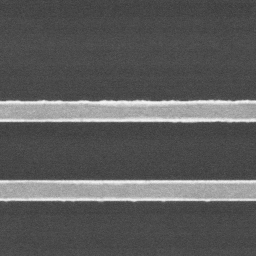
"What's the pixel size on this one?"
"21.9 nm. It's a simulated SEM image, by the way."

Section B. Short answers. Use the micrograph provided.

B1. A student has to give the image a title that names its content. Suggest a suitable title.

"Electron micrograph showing lines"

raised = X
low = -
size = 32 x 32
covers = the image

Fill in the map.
--------------------------------
--------------------------------
--------------------------------
--------------------------------
--------------------------------
--------------------------------
--------------------------------
--------------------------------
--------------------------------
--------------------------------
--------------------------------
--------------------------------
--------------------------------
XXXXXXXXXXXXXXXXXXXXXXXXXXXXXXXX
XXXXXXXXXXXXXXXXXXXXXXXXXXXXXXXX
--------------------------------
--------------------------------
--------------------------------
--------------------------------
--------------------------------
--------------------------------
--------------------------------
--------------------------------
XXXXXXXXXXXXXXXXXXXXXXXXXXXXXXXX
XXXXXXXXXXXXXXXXXXXXXXXXXXXXXXXX
--------------------------------
--------------------------------
--------------------------------
--------------------------------
--------------------------------
--------------------------------
--------------------------------